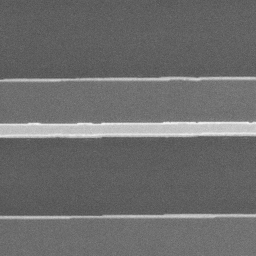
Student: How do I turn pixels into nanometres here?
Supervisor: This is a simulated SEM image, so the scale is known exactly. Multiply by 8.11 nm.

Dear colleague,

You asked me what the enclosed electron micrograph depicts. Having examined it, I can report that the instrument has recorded lines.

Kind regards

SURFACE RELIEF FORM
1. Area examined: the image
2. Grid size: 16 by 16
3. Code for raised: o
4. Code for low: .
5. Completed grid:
................
................
................
................
................
oooooooooooooooo
oooooooooooooooo
oooooooooooooooo
ooo..o..........
................
................
................
................
................
oooooooooooooooo
oooooooooooooooo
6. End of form